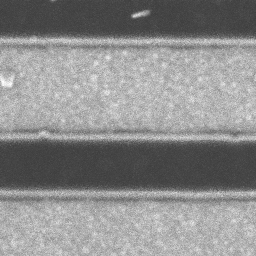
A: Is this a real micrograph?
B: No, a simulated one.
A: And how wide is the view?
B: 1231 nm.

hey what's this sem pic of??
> one or a few lines or trenches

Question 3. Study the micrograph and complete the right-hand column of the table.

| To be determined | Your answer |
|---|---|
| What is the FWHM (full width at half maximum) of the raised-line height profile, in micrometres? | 0.285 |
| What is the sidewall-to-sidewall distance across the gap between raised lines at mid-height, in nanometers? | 445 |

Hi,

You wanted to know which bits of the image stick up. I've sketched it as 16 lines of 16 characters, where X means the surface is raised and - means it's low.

XXXXXXXXXXXXXXXX
XXXXXXXXXXXXXXXX
XXXXXXXXXXXXXXXX
----------------
----------------
----------------
----------------
----------------
XXXXX-XXXXX-X---
XXXXXXXXXXXXXXXX
XXXXXXXXXXXXXXXX
XXXXXXXXXXXXXXXX
----------------
----------------
----------------
----------------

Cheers